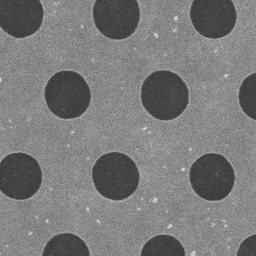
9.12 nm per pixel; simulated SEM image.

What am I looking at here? holes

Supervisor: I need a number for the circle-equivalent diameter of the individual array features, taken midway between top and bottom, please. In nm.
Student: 434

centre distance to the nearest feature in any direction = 0.863 µm